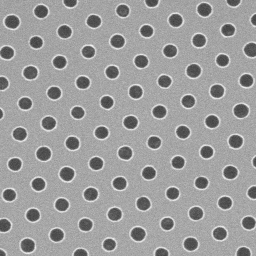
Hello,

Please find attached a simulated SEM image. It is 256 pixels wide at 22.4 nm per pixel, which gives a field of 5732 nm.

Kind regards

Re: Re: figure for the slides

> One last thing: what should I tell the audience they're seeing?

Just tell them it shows a regular array of holes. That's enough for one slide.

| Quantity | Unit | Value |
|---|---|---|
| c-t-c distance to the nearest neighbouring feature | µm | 0.686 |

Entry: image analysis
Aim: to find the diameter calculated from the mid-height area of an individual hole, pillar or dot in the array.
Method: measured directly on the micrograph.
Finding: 0.315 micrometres